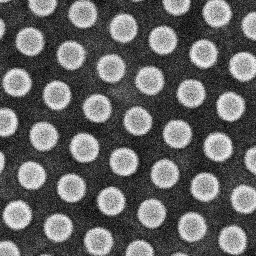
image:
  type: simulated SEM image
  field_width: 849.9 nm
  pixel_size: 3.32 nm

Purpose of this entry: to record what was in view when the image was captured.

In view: a regular array of raised bodies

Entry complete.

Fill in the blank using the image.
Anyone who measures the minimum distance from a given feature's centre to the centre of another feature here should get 0.138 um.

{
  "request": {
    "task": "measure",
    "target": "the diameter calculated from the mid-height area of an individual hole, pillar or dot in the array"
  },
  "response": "89.8 nanometres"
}